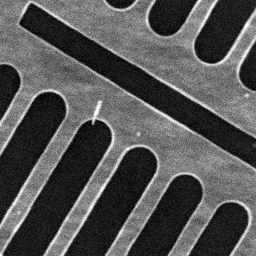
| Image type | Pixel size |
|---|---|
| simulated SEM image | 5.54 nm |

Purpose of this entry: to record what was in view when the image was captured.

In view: groups of lines, slits or small figures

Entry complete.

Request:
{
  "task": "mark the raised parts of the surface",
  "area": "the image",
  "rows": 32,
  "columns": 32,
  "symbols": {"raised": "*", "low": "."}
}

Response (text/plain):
*************....**......**.....
***...*************.....**......
**......**********.....***.....*
***......**********....**......*
****.......*********.****.....**
******......************.....***
********......**********.....**.
*********.......*********...**..
..*********.......************..
..***********......***********..
...***********.......*********..
..***..*********.......*********
..**....**********......********
.***....***********.......******
.**.....*************......*****
**......**...*********.......***
**.....***....**********.......*
*.....***.....************......
*.....**......**..*********.....
.....***.....**....**********...
.....**.....***.....***********.
....**......**......************
...***.....***.....**....*******
...**......**.....***....*******
..***.....**......**.....*******
..**.....***.....***.....***..**
.**......**......**.....***....*
.**.....***.....**......**.....*
**......**.....***.....***.....*
**.....**......**.....***.....**
*.....***.....**......**......**
......**.....***.....***.....***